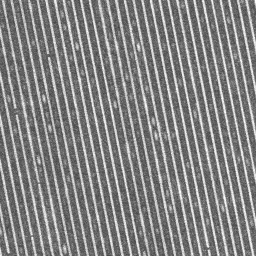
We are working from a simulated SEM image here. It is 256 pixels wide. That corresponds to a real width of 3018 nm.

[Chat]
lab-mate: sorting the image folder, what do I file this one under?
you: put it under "parallel lines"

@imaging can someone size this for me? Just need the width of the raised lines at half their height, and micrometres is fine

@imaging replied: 0.0203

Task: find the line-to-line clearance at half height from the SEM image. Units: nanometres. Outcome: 80.9